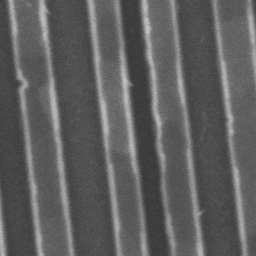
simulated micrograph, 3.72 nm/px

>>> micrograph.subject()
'one or a few lines or trenches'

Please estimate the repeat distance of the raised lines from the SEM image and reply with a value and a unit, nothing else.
244 nm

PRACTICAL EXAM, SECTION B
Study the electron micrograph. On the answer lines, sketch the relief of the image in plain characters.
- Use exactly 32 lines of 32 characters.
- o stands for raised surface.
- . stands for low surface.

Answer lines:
.oooo......oooo...oooo.....oooo.
.oooo......oooo...oooo.....oooo.
..oooo.....oooo...oooo.....ooooo
..oooo......ooo...oooo.....ooooo
..oooo......ooo...oooo.....ooooo
..oooo......ooo...oooo.....ooooo
..oooo......ooo....ooo.....ooooo
..oooo......ooo....ooo......oooo
..oooo......oooo...ooo......oooo
..oooo......oooo...oooo.....oooo
...ooo......oooo...oooo.....oooo
...oooo.....oooo...oooo.....oooo
...oooo......ooo...oooo.....oooo
...oooo......ooo...oooo.....oooo
...oooo......ooo...oooo......ooo
...oooo......ooo....ooo......ooo
...oooo......ooo....oooo.....ooo
...oooo......oooo...oooo.....ooo
...ooooo.....oooo...oooo.....ooo
....oooo.....oooo...oooo.....ooo
....oooo......ooo...oooo.....ooo
....oooo......ooo...oooo.....ooo
....oooo......ooo...oooo.....ooo
....oooo......ooo...oooo......oo
....oooo......ooo....ooo......oo
....oooo......oooo...oooo.....oo
....oooo......oooo...oooo.....oo
....oooo......oooo...oooo.....oo
.....oooo.....oooo...oooo.....oo
.....oooo......ooo...oooo.....oo
.....oooo......ooo...oooo.....oo
.....oooo......ooo....ooo.....oo